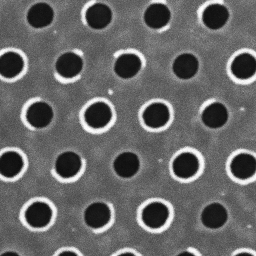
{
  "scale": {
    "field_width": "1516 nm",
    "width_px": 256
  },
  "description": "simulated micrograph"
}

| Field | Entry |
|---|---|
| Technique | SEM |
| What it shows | a regular array of holes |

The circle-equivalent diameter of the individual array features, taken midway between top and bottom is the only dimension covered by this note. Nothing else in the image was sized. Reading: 0.156 micrometres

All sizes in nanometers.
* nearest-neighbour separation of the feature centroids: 340